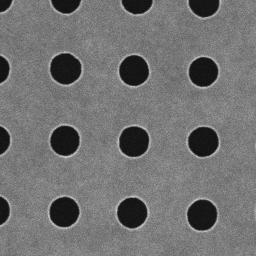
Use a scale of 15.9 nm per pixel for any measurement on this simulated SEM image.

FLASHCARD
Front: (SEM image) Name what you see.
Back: a regular array of holes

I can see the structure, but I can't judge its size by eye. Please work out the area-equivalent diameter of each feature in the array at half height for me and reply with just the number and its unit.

488 nanometres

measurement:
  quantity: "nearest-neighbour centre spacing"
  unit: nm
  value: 1100